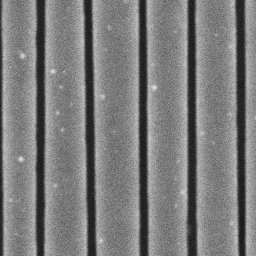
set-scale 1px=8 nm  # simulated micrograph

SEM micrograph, lines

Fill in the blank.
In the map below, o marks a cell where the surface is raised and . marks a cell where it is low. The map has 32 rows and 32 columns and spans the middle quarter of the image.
ooooo..oooooooooooo..oooooooooo.
ooooo...ooooooooooo..oooooooooo.
ooooo...ooooooooooo..oooooooooo.
ooooo...ooooooooooo..oooooooooo.
ooooo...ooooooooooo..oooooooooo.
ooooo...ooooooooooo..oooooooooo.
ooooo...ooooooooooo..oooooooooo.
ooooo...ooooooooooo..oooooooooo.
ooooo...ooooooooooo..oooooooooo.
ooooo...ooooooooooo..oooooooooo.
ooooo...ooooooooooo..oooooooooo.
ooooo...ooooooooooo..oooooooooo.
ooooo...ooooooooooo..oooooooooo.
ooooo...ooooooooooo..oooooooooo.
ooooo...ooooooooooo..oooooooooo.
ooooo...ooooooooooo..oooooooooo.
ooooo...ooooooooooo..oooooooooo.
ooooo...ooooooooooo..oooooooooo.
ooooo...ooooooooooo..oooooooooo.
ooooo...ooooooooooo..oooooooooo.
ooooo...ooooooooooo..oooooooooo.
ooooo...ooooooooooo..oooooooooo.
ooooo...ooooooooooo..oooooooooo.
ooooo...ooooooooooo..oooooooooo.
ooooo...ooooooooooo..oooooooooo.
ooooo...ooooooooooo..oooooooooo.
ooooo...ooooooooooo..oooooooooo.
ooooo...ooooooooooo..oooooooooo.
ooooo...ooooooooooo..oooooooooo.
ooooo...ooooooooooo..oooooooooo.
ooooo...ooooooooooo..oooooooooo.
ooooo...ooooooooooo..oooooooooo.